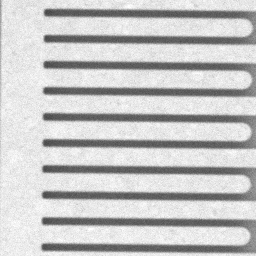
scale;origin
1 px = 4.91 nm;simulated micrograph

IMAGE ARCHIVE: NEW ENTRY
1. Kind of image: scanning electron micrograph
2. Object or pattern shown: groups of lines, slits or small figures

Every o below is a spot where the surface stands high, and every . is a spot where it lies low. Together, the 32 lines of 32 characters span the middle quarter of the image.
................................
oooooooooooooooooo..............
oooooooooooooooooooooooooooooooo
oooooooooooooooooooooooooooooooo
oooooooooooooooooooooooooooooooo
oooooooooooooooooooooooooooooooo
................................
................................
oooooooooooooooooooooooooooooooo
oooooooooooooooooooooooooooooooo
oooooooooooooooooooooooooooooooo
oooooooooooooooooooooooooooooooo
...........................ooooo
................................
ooooo...........................
oooooooooooooooooooooooooooooooo
oooooooooooooooooooooooooooooooo
oooooooooooooooooooooooooooooooo
oooooooooooooooooooooooooooooooo
................................
................................
oooooooooooooooooooooooooooooooo
oooooooooooooooooooooooooooooooo
oooooooooooooooooooooooooooooooo
oooooooooooooooooooooooooooooooo
................................
................................
oooooooooooo....................
oooooooooooooooooooooooooooooooo
oooooooooooooooooooooooooooooooo
oooooooooooooooooooooooooooooooo
oooooooooooooooooooooooooooooooo